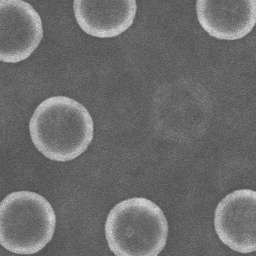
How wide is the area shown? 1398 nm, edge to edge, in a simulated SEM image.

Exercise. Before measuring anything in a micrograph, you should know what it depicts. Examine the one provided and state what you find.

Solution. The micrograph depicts raised bodies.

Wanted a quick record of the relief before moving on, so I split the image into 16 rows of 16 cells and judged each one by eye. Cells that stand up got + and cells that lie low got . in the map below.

++...+++....++++
++...+++.....+++
++..............
+...............
................
................
...++...........
..++++..........
..++++..........
...++...........
................
................
+++...........++
+++....+++....++
+++....+++....++
.+.....+++.....+